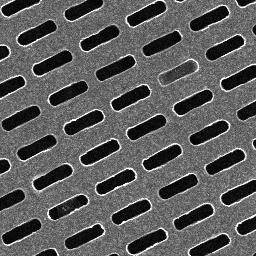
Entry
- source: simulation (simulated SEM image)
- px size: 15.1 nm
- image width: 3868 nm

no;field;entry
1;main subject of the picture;a regular array of holes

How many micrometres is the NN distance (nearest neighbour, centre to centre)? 0.505